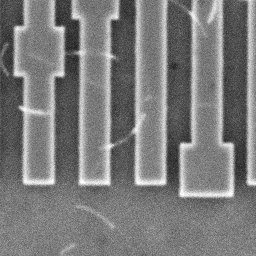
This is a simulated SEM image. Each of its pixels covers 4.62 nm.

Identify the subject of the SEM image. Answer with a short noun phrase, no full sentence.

wiring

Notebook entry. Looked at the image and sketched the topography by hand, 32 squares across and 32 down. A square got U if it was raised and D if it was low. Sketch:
DDDUUUUDDUUUUUUDDUUUUDDDUUUUDDDU
DDDUUUUDDUUUUUUDDUUUUDDDUUUUDDDU
DDDUUUUDDDUUUUDDDUUUUDDDUUUUDDDU
DDUUUUUUDDUUUUDDDUUUUDDDUUUUDDDU
DDUUUUUUDDUUUUDDDUUUUDDDUUUUDDDU
DDUUUUUUDDUUUUDDDUUUUDDDUUUUDDDU
DDUUUUUUDDUUUUDDDUUUUDDDUUUUDDDU
DDUUUUUUDDUUUUDDDUUUUDDDUUUUDDDU
DDUUUUUUDDUUUUDDDUUUUDDDUUUUDDDU
DDDUUUUUDDUUUUDDDUUUUDDDUUUUDDDU
DDDUUUUDDDUUUUDDDUUUUDDDUUUUDDDU
DDDUUUUDDDUUUUDDDUUUUDDDUUUUDDDU
DDDUUUUDDDUUUUDDDUUUUDDDUUUUDDDU
DDDUUUUDDDUUUUDDDUUUUDDDUUUUDDDU
DDDUUUUDDDUUUUDDDUUUUDDDUUUUDDDU
DDDUUUUDDDUUUUDDDUUUUDDDUUUUDDDU
DDDUUUUDDDUUUUDDDUUUUDDDUUUUDDDU
DDDUUUUDDDUUUUDDDUUUUDDDUUUUDDDU
DDDUUUUDDDUUUUDDDUUUUDDUUUUUUDDU
DDDUUUUDDDUUUUDDDUUUUDDUUUUUUDDU
DDDUUUUDDDUUUUDDDUUUUDDUUUUUUDDU
DDDUUUUDDDUUUUDDDUUUUDDUUUUUUDDU
DDDUUUUDDDUUUUDDDUUUUDDUUUUUUDDU
DDDDDDDDDDDDDDDDDDDDDDDUUUUUUDDD
DDDDDDDDDDDDDDDDDDDDDDDDDDDDDDDD
DDDDDDDDDDDDDDDDDDDDDDDDDDDDDDDD
DDDDDDDDDDDDDDDDDDDDDDDDDDDDDDDD
DDDDDDDDDDDDDDDDDDDDDDDDDDDDDDDD
DDDDDDDDDDDDDDDDDDDDDDDDDDDDDDDD
DDDDDDDDDDDDDDDDDDDDDDDDDDDDDDDD
DDDDDDDDDDDDDDDDDDDDDDDDDDDDDDDD
DDDDDDDDDDDDDDDDDDDDDDDDDDDDDDDD